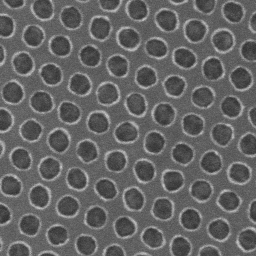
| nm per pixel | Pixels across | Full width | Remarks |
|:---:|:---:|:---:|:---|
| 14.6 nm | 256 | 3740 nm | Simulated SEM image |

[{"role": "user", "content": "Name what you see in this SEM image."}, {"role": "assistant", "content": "a regular array of holes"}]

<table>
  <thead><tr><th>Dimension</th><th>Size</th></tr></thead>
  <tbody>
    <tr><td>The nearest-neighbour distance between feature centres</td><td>0.431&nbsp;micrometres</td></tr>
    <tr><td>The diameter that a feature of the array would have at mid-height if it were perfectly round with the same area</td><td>308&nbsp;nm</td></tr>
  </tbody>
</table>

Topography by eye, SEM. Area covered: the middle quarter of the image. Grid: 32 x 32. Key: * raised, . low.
******..***.....****.********...
***********.....***...**********
***.********...***.....*********
**....************.....***...***
*.....************.....**.....**
*......**....******..****.....**
**.....*.....************.....**
***...**......***..*******...***
********......**....************
.********....**.....************
...*************....***....*****
....************....***.....****
....***...*******...**......****
....**.....***********......**..
...***.....****.*******....***..
******.....***....************..
*******....**.....************..
.************.....***...*******.
.************.....***....*******
.***...********.****.....*******
.**.....************.....***...*
***.....*************...***.....
***......**....************.....
****....**.....************.....
*****.****......**...*******...*
***********....***....**********
*...*******...****.....*********
*....*************.....**....***
*.....*************...***.....**
*.....**....*************.....**
**...***.....************....***
********.....***..********..****